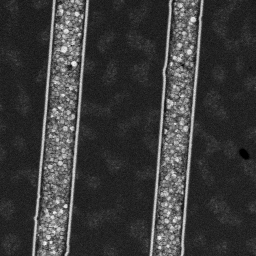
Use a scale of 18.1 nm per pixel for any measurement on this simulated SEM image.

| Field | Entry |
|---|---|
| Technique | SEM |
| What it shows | one or a few lines or trenches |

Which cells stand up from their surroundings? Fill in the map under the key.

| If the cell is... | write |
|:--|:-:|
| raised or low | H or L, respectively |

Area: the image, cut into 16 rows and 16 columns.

HHHLLHHHHHHLLHHH
HHHLLHHHHHHLLHHH
HHHLLHHHHHHLHHHH
HHHLLHHHHHLLHHHH
HHHLLHHHHHLLHHHH
HHHLLHHHHHLLHHHH
HHHLLHHHHHLLHHHH
HHHLLHHHHHLLHHHH
HHHLLHHHHHLLHHHH
HHHLLHHHHHLLHHHH
HHHLLHHHHHLLHHHH
HHLLLHHHHHLLHHHH
HHLLLHHHHHLLHHHH
HHLLHHHHHHLLHHHH
HHLLHHHHHHLHHHHH
HHLLHHHHHLLHHHHH